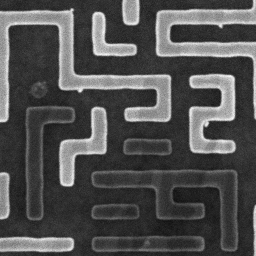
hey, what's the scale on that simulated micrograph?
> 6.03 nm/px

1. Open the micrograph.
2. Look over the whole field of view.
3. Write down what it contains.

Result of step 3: wiring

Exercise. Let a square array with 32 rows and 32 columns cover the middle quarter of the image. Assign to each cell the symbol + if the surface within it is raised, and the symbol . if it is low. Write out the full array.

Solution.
++..............................
++..............................
+++.............................
+++++++++++++++++++++++++++.....
+++++++++++++++++++++++++++.....
+++++++++++++++++++++++++++.....
.......................++++.....
.......................++++.....
.......................++++.....
.......................++++.....
.......................++++.....
++.....+++.....++++++++++++.....
+++....+++.....++++++++++++.....
+++....+++.....++++++++++++.....
+......++++.....................
.......++++.....................
.......++++.....................
.......++++.....................
.......+++......................
++++++++++.....++++++++++++.....
++++++++++.....++++++++++++.....
++++++++++.....++++++++++++.....
++++...................+++......
+++.............................
++..............................
++..............................
++..............................
++.....+++++++++++++++++++++++++
++.....+++++++++++++++++++++++++
++.....+++++++++++++++++++++++++
........++++++++++++++++++++++++
.......................++++.....